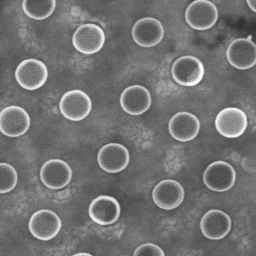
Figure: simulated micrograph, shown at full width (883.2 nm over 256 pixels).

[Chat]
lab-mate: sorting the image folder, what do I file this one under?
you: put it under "a regular array of raised bodies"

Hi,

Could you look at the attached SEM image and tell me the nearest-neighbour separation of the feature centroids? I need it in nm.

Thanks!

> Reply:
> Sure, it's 186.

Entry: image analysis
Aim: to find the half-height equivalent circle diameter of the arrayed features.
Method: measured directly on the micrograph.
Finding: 104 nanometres